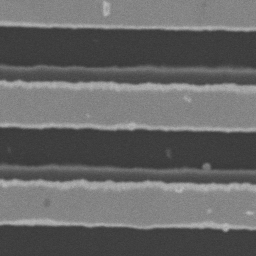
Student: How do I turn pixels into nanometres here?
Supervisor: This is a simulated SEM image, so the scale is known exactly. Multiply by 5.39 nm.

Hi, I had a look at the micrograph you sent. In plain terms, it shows lines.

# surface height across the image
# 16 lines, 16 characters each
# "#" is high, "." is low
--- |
################
################
................
................
################
################
################
################
................
................
#.##............
################
################
################
................
................